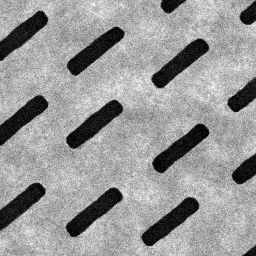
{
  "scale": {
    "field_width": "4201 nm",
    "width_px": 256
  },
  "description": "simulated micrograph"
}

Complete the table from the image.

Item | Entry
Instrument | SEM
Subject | holes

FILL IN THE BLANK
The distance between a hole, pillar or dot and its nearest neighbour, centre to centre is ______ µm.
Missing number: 1.22